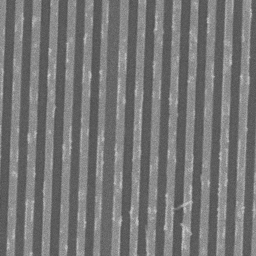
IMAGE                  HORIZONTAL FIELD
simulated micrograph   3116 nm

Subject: parallel lines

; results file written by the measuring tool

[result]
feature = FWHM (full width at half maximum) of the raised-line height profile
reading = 92.7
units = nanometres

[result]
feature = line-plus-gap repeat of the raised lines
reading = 213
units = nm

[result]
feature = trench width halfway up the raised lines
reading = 116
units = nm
